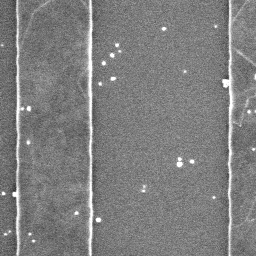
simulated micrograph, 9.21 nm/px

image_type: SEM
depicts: wiring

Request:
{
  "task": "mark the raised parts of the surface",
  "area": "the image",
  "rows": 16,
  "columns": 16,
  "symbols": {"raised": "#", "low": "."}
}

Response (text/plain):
.#####........##
.#####........##
.#####........##
.#####........##
.#####........##
.#####........##
.#####........##
.#####........##
.#####........##
.#####........##
.#####........##
.#####........##
.#####........##
.#####........##
.#####........##
.#####........##